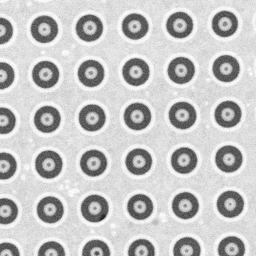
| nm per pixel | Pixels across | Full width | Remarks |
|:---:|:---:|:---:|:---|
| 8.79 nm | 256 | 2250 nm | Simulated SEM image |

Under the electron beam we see an array of small figures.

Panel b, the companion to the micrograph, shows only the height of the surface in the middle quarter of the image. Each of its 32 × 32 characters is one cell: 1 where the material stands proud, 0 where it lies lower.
11100000001111000000001111000000
11100010000111000110001110001100
11100011000111000110001110000100
11100000001111000000001111000000
11110000001111100000011111100000
11110000011111110000111111111011
11111111111111111111111111111111
11111111111111111111111111111111
11111111111111111111111111111111
11111101111111111000111111100000
11110000001111100000011111000000
11110000001111100000001111000000
11100000000111000110001111000110
11100011000111000110001111000110
11100000000111100000001111000000
11110000001111100000001111100000
11111000011111110000011111110001
11111111111111111111111111111111
11111111111111111111111111111111
11111111111111111111111111111111
11111111111111111111111111111001
11111000011111110000011111100000
11110000000111100000001111100000
11110000000111100010001111000110
11110011100111100011000111000110
11110011000111100000001111100000
11110000000111100000001111100000
11111000001111110000011111110000
11111110111111111111111111111111
11111111111111111111111111111111
11111111111111111111111111111111
11111111111111111111111111111101